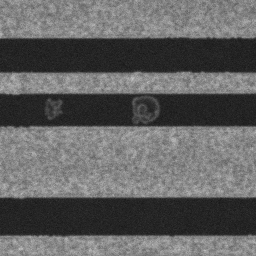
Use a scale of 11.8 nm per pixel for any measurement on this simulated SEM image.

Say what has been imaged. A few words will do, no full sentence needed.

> lines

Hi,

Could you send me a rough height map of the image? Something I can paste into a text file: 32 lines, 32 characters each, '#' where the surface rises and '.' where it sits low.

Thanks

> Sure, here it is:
################################
################################
################################
################################
################################
................................
................................
................................
................................
################################
################################
################################
.................##.............
......#..........###............
.................##.............
................................
################################
################################
################################
################################
################################
################################
################################
################################
################################
................................
................................
................................
................................
................................
################################
################################